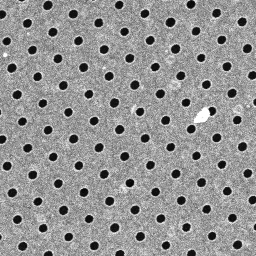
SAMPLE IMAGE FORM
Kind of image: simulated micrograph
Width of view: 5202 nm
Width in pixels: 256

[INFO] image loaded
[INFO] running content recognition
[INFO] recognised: a regular array of holes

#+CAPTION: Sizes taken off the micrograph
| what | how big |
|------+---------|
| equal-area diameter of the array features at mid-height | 9.1 px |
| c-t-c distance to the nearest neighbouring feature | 0.548 micrometres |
